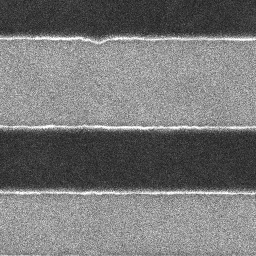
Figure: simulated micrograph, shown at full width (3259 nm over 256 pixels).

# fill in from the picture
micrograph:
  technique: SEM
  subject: one or a few lines or trenches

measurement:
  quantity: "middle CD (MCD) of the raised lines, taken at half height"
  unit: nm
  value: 858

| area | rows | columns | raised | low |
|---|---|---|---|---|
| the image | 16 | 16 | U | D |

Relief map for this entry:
UUUUUUUUUUUUUUUU
UUUUUUUUUUUUUUUU
DDDDDUUDDDDDDDUU
DDDDDDDDDDDDDDDD
DDDDDDDDDDDDDDDD
DDDDDDDDDDDDDDDD
DDDDDDDDDDDDDDDD
DDDDDDDDDDDDDDDD
UUUUUUUUUUUUUUUU
UUUUUUUUUUUUUUUU
UUUUUUUUUUUUUUUU
UUUUUUUUUUUUUUUU
DDDDDDDDDDDDDDDD
DDDDDDDDDDDDDDDD
DDDDDDDDDDDDDDDD
DDDDDDDDDDDDDDDD